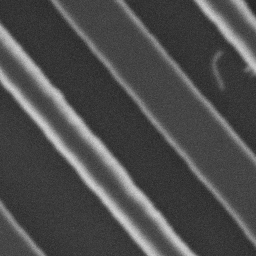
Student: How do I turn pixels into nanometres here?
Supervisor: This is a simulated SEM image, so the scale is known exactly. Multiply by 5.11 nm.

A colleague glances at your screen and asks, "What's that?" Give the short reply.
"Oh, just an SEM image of lines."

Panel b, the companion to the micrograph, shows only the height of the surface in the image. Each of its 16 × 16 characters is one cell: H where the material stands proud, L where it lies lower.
LLLLHHHHLLLLLHHL
LLLLHHHHHLLLLLHH
HLLLLHHHHHLLLLHH
HHLLLLHHHHHLLLLH
HHLLLLLHHHHLLLLL
LHHLLLLLHHHHLLLL
LHHHLLLLLHHHHLLL
LLHHHLLLLHHHHHLL
LLLHHHLLLLHHHHHL
LLLLHHHLLLLHHHHH
LLLLLHHHLLLLHHHH
LLLLLLHHLLLLLHHH
LLLLLLHHHLLLLLHH
HLLLLLLHHHLLLLLH
HLLLLLLLHHHLLLLH
HHLLLLLLLHHHLLLL